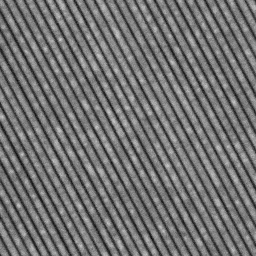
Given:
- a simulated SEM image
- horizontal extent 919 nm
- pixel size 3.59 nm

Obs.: parallel lines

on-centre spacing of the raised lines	0.0318	µm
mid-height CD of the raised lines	6.71	pixels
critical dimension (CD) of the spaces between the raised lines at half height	0.0091	microns